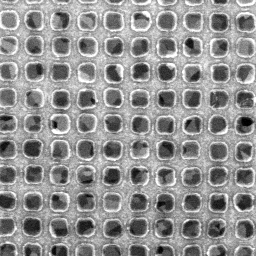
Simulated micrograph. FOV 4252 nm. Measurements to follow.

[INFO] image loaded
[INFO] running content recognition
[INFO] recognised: a regular array of raised bodies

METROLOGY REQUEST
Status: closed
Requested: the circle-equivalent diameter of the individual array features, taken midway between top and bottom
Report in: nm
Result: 324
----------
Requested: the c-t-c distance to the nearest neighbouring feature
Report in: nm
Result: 417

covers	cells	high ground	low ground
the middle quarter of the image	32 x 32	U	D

UDDDUUUUDDDUUUDDDUUUUDDDUUUUDDUU
UDDDUUUUDDUUUUDDDUUUUDDUUUUUDDUU
UDDDUUUUDDUUUUDDDUUUUDDUUUUUDDUU
UDDDUUUUDDUUUUUDDUUUUDDDUUUUDDUU
DDDDDDDDDDDUUUDDDDDDDDDDDDDDDDDD
DDDDDDDDDDDDDDDDDDDDDDDDDDDDDDDD
DDDDDDDDDDDUUUDDDDDDDDDDDDUDDDDU
UDDDUUUUDDUUUUDDDUUUUDDDUUUUDDUU
UDDUUUUUDDUUUUDDDUUUUDDUUUUUDDUU
UUDUUUUUDDUUUUDDDUUUUDDUUUUUDDUU
UDDDUUUDDDDUUUDDDUUUUDDDUUUDDDUU
DDDDDDDDDDDDDDDDDDDDDDDDDDDDDDDD
DDDDDDDDDDDDDDDDDDDDDDDDDDDDDDDD
UDDDUUUUDDUUUUDDDUUUUDDDUUUDDDDU
UDDDUUUUDDUUUUUDDUUUUDDUUUUDDDUU
UDDDUUUUDDDUUUDDDUUUUDDUUUUDDDUU
UDDDUUUDDDDUUUDDDUUUUDDUUUUDDDUU
DDDDDDDDDDDDDDDDDDDDDDDDDDDDDDDU
DDDDDDDDDDDDDDDDDDDDDDDDDDDDDDDD
UDDDUUUDDDDUUUDDDUUUUDDDUUUDDDDU
UDDUUUUUDDUUUUUDDUUUUDDUUUUUDDUU
UDDUUUUUDDUUUUUDDUUUUDDUUUUUDDUU
UDDUUUUUDDUUUUDDDUUUUDDUUUUUDDUU
UDDDUUUDDDDUUUDDDDDDDDDDUUUDDDUU
DDDDDDDDDDDDDDDDDDDDDDDDDDDDDDDD
DDDDDDDDDDDDDDDDDDDDDDDDDDDDDDDD
UDDUUUUUDDUUUUDDDUUUUDDDUUUDDDUU
UDDUUUUDDDUUUUDDDUUUUDDUUUUDDDUU
UDDUUUUDDDUUUUDDDUUUUDDUUUUDDDUU
UDDUUUUDDDUUUUDDDUUUUDDUUUUDDDUU
DDDDDDDDDDDDDDDDDDDDDDDDDDDDDDDU
DDDDDDDDDDDDDDDDDDDDDDDDDDDDDDDD